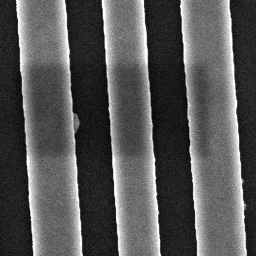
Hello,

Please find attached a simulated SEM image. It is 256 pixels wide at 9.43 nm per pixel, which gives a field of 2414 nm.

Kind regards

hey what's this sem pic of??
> lines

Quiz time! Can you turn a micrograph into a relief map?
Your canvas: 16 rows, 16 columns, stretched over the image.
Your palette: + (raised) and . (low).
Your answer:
.+++..+++..+++..
.+++..+++..+++..
.+++...++..+++..
.+++...++...+++.
.+++...++...+++.
.+++...++...+++.
.+++...++...+++.
..+++..++...+++.
..+++..+++..+++.
..+++..+++..+++.
..+++..+++..+++.
..+++..+++..+++.
..+++..+++..+++.
..+++..+++..+++.
..+++..+++..+++.
..+++..+++..+++.